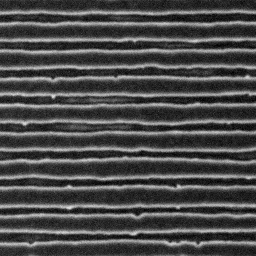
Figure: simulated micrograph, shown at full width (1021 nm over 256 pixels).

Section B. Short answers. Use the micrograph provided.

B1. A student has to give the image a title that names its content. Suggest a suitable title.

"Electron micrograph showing parallel lines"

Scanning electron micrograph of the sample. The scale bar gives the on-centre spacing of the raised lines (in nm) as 109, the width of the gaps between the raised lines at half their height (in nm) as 33.4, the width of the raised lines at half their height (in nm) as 77.3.